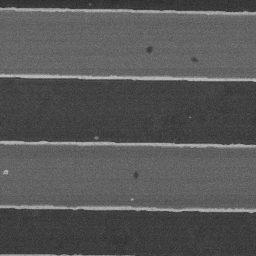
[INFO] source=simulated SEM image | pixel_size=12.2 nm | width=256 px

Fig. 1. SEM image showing lines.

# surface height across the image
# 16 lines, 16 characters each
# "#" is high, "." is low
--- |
................
################
################
################
################
................
................
................
................
################
################
################
################
................
................
................